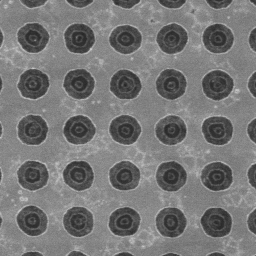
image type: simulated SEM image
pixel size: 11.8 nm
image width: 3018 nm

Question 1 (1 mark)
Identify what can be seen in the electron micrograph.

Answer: a regular array of ring-shaped grooves with a dot in the middle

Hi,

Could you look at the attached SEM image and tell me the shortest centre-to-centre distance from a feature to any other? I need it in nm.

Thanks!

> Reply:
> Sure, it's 536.